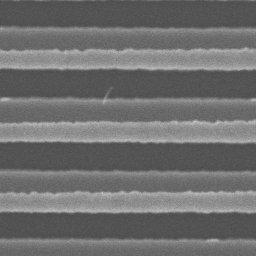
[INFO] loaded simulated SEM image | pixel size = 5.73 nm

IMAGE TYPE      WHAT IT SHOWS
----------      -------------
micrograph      lines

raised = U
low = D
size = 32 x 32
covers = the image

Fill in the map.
DDDDDDDDDDDDDDDDDDDDDDDDDDDDDDDD
DDDDDDDDDDDDDDDDDDDDDDDDDDDDDDDD
DDDDDDDDDDDDDDDDDDDDDDDDDDDDDDDD
DDDDDDDDDDDDDDDDDDDDDDDDDDDDDDDD
UUUUUUUUUUUUUUUUUUUUUUUUUUUUUUUU
UUUUUUUUUUUUUUUUUUUUUUUUUUUUUUUU
UUUUUUUUUUUUUUUUUUUUUUUUUUUUUUUU
UUUUUUUUUUUUUUUUUUUUUUUUUUUUUUUU
DUUUUUUUUUUUUUUUUUUUUUUUUUUUUUUU
DDDDDDDDDDDDDDDDDDDDDDDDDDDDDDDD
DDDDDDDDDDDDDDDDDDDDDDDDDDDDDDDD
DDDDDDDDDDDDDDDDDDDDDDDDDDDDDDDD
UUUUUUUUUUDUDUUUDUDUUUUUUDUDDUDU
UUUUUUUUUUUUUUUUUUUUUUUUUUUUUUUU
UUUUUUUUUUUUUUUUUUUUUUUUUUUUUUUU
UUUUUUUUUUUUUUUUUUUUUUUUUUUUUUUU
UUUUUUUUUUUUUUUUUUUUUUUUUUUUUUUU
UUUUUUUUUUUUUUUUUUUUUUUUUUUUUUUU
DDDDDDDDDDDDDDDDDDDDDDDDDDDDDDDD
DDDDDDDDDDDDDDDDDDDDDDDDDDDDDDDD
DDDDDDDDDDDDDDDDDDDDDDDDDDDDDDDD
UUUUUDDDUUDDUDUDDDDDDDDDDDDDDDDD
UUUUUUUUUUUUUUUUUUUUUUUUUUUUUUUU
UUUUUUUUUUUUUUUUUUUUUUUUUUUUUUUU
UUUUUUUUUUUUUUUUUUUUUUUUUUUUUUUU
UUUUUUUUUUUUUUUUUUUUUUUUUUUUUUUU
DDDDDDDDDDDUDDUDDDDUDDDDDUDDDDDU
DDDDDDDDDDDDDDDDDDDDDDDDDDDDDDDD
DDDDDDDDDDDDDDDDDDDDDDDDDDDDDDDD
DDDDDDDDDDDDDDDDDDDDDDDDDDDDDDDD
UUUUUUUUUUUUUUUUUUUUUUUUUUUUUUUU
UUUUUUUUUUUUUUUUUUUUUUUUUUUUUUUU